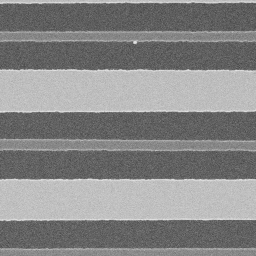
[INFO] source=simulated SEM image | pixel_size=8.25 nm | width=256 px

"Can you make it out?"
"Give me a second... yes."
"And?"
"lines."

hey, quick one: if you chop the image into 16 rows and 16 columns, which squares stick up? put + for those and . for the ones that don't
................
................
................
................
++++++++++++++++
++++++++++++++++
++++++++++++++++
................
................
................
................
++++++++++++++++
++++++++++++++++
++++++++++++++++
................
................